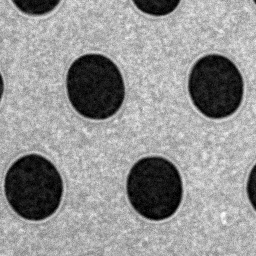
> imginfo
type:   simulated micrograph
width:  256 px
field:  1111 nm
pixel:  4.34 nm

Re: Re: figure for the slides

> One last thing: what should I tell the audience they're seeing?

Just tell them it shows holes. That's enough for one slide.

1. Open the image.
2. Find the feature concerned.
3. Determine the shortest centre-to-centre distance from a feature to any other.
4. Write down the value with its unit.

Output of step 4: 511 nanometers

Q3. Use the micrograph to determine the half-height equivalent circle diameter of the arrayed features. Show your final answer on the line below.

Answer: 0.271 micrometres